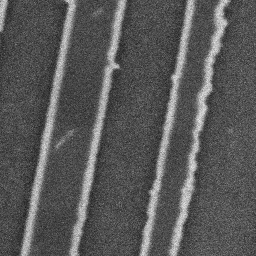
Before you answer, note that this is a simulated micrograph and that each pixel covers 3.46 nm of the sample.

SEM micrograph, one or a few lines or trenches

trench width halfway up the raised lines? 234 nm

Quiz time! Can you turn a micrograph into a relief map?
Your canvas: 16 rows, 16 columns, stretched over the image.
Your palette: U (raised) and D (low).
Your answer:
DDDDUUUUDDDDUUDD
DDDDUUUDDDDDUUDD
DDDDUUUDDDDDUUDD
DDDDUUUDDDDUUDDD
DDDDUUUDDDDUUDDD
DDDUUUUDDDDUUDDD
DDDUUUDDDDDUUDDD
DDDUUUDDDDDUDDDD
DDDUUUDDDDUUDDDD
DDDUUUDDDDUUDDDD
DDDUUUDDDDUUDDDD
DDUUUDDDDDUUDDDD
DDUUUDDDDDUUDDDD
DDUUUDDDDUUDDDDD
DDUUUDDDDUUDDDDD
DDUUUDDDDUUDDDDD